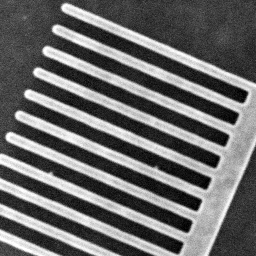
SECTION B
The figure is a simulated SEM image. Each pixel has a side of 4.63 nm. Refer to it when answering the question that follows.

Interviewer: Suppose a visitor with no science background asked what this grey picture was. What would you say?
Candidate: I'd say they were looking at groups of lines, slits or small figures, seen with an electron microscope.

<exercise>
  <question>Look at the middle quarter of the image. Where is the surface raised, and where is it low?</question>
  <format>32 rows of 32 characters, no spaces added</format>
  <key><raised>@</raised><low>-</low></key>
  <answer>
--@@@@@---------@@@@@@---------@
----@@@@@@---------@@@@@@-------
------@@@@@@---------@@@@@@-----
---------@@@@@@---------@@@@@---
@@---------@@@@@@---------@@@@@-
@@@@----------@@@@@---------@@@@
-@@@@@---------@@@@@@---------@@
---@@@@@@---------@@@@@@--------
-----@@@@@@---------@@@@@@------
--------@@@@@@---------@@@@@----
@---------@@@@@@---------@@@@@@-
@@@---------@@@@@@---------@@@@@
@@@@@@---------@@@@@@---------@@
--@@@@@@---------@@@@@@---------
-----@@@@@----------@@@@@-------
-------@@@@@@---------@@@@@@----
---------@@@@@@---------@@@@@@--
@@@---------@@@@@@---------@@@@@
@@@@@---------@@@@@@---------@@@
--@@@@@---------@@@@@@---------@
----@@@@@---------@@@@@@--------
------@@@@@@---------@@@@@@-----
--------@@@@@@---------@@@@@@---
@@---------@@@@@@---------@@@@@-
@@@@---------@@@@@@---------@@@@
-@@@@@---------@@@@@@---------@@
---@@@@@@---------@@@@@@--------
-----@@@@@@---------@@@@@@------
--------@@@@@---------@@@@@@----
@---------@@@@@---------@@@@@@--
@@@---------@@@@@@---------@@@@@
@@@@@----------@@@@@---------@@@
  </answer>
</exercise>